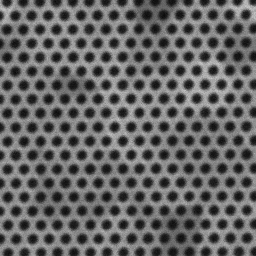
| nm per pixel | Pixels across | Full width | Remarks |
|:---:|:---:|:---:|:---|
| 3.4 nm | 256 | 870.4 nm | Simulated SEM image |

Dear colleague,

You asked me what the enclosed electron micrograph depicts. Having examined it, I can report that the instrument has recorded a regular array of holes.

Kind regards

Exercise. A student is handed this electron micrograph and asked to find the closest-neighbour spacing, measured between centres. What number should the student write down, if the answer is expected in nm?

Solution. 54.3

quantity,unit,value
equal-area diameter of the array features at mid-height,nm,40.8